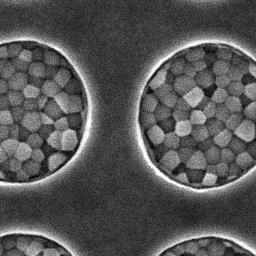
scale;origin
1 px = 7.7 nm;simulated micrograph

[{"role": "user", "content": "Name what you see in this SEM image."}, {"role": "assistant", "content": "holes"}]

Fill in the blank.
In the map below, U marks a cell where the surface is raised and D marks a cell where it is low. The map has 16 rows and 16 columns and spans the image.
UUUUUUUUUUUUUUUU
UUUUUUUUUUUUUUUU
UUUUUUUUUUUUUUUU
DDDDUUUUUUUDDDDD
DDDDDUUUUUDDDDDD
DDDDDUUUUDDDDDDD
DDDDDDUUUDDDDDDD
DDDDDUUUUDDDDDDD
DDDDDUUUUDDDDDDD
DDDDDUUUUDDDDDDD
DDDDUUUUUUDDDDDD
UUUUUUUUUUUDDDUU
UUUUUUUUUUUUUUUU
UUUUUUUUUUUUUUUU
UUUUUUUUUUUUUUUU
DDDDUUUUUUUDDDDU